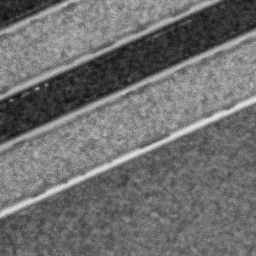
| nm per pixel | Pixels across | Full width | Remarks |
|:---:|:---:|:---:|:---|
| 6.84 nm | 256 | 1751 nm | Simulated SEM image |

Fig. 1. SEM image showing one or a few lines or trenches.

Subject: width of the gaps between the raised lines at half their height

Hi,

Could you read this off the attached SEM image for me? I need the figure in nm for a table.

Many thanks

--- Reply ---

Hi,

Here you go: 311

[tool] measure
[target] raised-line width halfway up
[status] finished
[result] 418 nm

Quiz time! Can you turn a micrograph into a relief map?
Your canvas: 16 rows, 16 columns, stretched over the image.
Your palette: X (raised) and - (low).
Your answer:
---XXXXXXXXX----
-XXXXXXXXX------
XXXXXXXX-------X
XXXXXX-------XXX
XXXX------XXXXXX
X-------XXXXXXXX
------XXXXXXXXX-
----XXXXXXXXX---
--XXXXXXXXX-----
XXXXXXXXX-------
XXXXXXX---------
XXXX------------
XX--------------
----------------
----------------
----------------